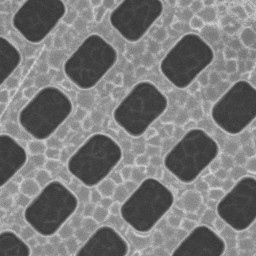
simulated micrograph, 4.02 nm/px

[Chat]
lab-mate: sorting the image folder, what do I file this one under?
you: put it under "a regular array of holes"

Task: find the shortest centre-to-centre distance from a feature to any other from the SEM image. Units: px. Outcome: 66.8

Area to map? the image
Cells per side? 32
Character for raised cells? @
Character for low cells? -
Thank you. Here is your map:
@@@-----@@@@@@@-----@@@@@@@@@@@@
@@------@@@@@@------@@@@@@@@@@@@
@@-----@@@@@@@-----@@@@@@@@@@@@@
@@-----@@@@@@@-----@@@@@@@@@@@@@
@@@---@@@@@-@@@---@@@@@--@@@@@@@
-@@@@@@@@@----@@@@@@@@----@@@@@@
--@@@@@@@-----@@@@@@@------@@@@@
--@@@@@@@-----@@@@@@------@@@@@@
--@@@@@@------@@@@@@------@@@@@@
-@@@@@@@@----@@@@@@@@----@@@@@@@
@@@@@@@@@@--@@@@@--@@@--@@@@@--@
@@@@@---@@@@@@@@----@@@@@@@@----
@@@@-----@@@@@@@-----@@@@@@-----
@@@------@@@@@@------@@@@@@-----
@@-------@@@@@------@@@@@@@-----
@@@-----@@@@@@@----@@@@@@@@----@
@@@@---@@@@@@@@@--@@@@@@--@@@-@@
--@@@@@@@@@---@@@@@@@@@----@@@@@
---@@@@@@@-----@@@@@@@-----@@@@@
---@@@@@@------@@@@@@------@@@@@
---@@@@@@------@@@@@@-----@@@@@@
--@@@@@@@-----@@@@@@@----@@@@@@@
-@@@@@@@@@---@@@@@-@@@@-@@@@@@--
@@@@@@--@@@@@@@@@----@@@@@@@@---
@@@@@----@@@@@@@------@@@@@@----
@@@@------@@@@@------@@@@@@-----
@@@------@@@@@@------@@@@@@-----
@@@-----@@@@@@@@----@@@@@@@@----
@@@@---@@@@@@-@@@--@@@@@@-@@@--@
--@@@@@@@@@----@@@@@@@@@---@@@@@
---@@@@@@@@-----@@@@@@@-----@@@@
----@@@@@@------@@@@@@------@@@@